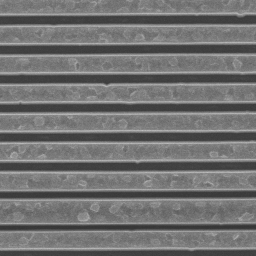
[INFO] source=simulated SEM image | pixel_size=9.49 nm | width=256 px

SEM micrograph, parallel lines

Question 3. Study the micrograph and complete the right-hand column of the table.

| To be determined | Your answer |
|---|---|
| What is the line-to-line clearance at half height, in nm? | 93.7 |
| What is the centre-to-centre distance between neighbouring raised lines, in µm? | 0.278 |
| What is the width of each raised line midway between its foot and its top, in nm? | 178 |